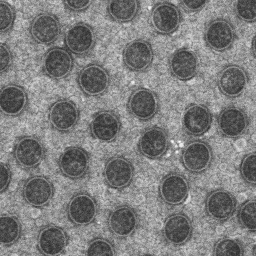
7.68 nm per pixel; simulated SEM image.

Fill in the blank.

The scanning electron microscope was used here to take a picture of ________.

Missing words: a regular array of raised bodies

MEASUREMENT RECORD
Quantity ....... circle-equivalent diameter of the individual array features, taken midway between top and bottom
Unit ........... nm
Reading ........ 213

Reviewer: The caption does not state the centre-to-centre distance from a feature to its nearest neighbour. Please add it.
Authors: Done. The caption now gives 0.31 micrometres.